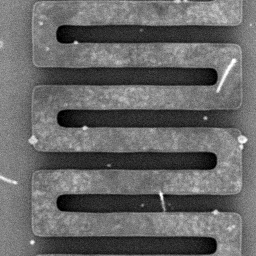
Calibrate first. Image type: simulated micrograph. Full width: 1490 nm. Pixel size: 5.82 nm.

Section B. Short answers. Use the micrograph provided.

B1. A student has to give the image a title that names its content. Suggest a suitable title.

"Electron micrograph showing groups of lines, slits or small figures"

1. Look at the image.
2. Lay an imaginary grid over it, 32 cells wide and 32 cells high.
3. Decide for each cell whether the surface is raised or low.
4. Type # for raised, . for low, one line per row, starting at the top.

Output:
.....#########################..
....##########################..
....##########################..
....###.........................
....###.........................
....#######################.....
....##########################..
....##########################..
..........................####..
...........................###..
...........................###..
....##########################..
....##########################..
....##########################..
....###.........................
....###.........................
....##########################..
....###########################.
....##########################..
...........................###..
...........................###..
.....#########################..
....##########################..
....##########################..
....###.........................
....###.........................
....#####.................##....
....##########################..
....##########################..
..........................####..
...........................###..
...........................###..